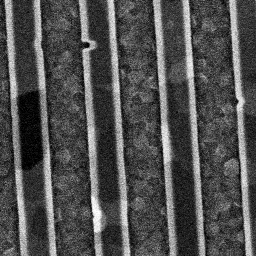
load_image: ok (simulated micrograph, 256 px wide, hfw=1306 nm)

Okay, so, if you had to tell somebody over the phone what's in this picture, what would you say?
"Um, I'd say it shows one or a few lines or trenches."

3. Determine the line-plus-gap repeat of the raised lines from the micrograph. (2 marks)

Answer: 74.5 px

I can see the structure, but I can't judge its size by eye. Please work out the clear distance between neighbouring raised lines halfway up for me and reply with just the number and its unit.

233 nm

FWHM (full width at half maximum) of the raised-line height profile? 0.148 um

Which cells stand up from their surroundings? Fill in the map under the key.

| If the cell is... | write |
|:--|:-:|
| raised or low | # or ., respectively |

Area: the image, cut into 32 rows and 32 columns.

.####.....####......###......###
.####.....####......###......###
.####.....####......###......###
.####......###......###......###
.####......###......####.....###
.####......###......####.....###
.####......###......####.....###
.####......###......####.....###
.####......###......####......##
.####......###......####......##
..###......####.....####......##
..###......####.....####......##
..###......####.....####......##
..####.....####.....####......##
..####.....####.....####......##
..####.....####.....####......##
..####.....####......###......##
..####.....####......###......##
..####.....####......####.....##
..####.....####......####.....##
..####......###......####.....##
..####......###......####.....##
..####......###......####.....##
..####......###......####......#
..####......###......####......#
...###......####.....####......#
...###......####.....####......#
...###......####.....####......#
...###......####.....####......#
...####.....####.....####......#
...####.....####......###......#
...####.....####......###......#